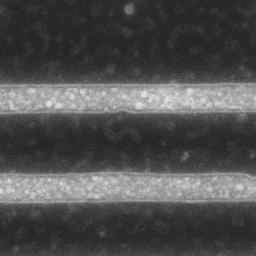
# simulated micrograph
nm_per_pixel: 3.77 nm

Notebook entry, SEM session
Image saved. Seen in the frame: one or a few lines or trenches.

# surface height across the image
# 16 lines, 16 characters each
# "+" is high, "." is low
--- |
++++++++++++++++
++++++++++++++++
++++++++++++++++
++++++++++++++++
++++++++++++++++
................
................
++++++++++++++++
++++++++++++++++
++++++++++++++++
++++++++++++++++
................
................
++++++++++++++++
++++++++++++++++
++++++++++++++++